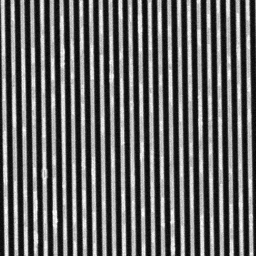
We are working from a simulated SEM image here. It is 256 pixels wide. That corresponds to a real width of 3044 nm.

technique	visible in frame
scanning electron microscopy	parallel lines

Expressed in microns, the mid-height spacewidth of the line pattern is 0.0698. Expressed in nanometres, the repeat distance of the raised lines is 116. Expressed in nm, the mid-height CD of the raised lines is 40.1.